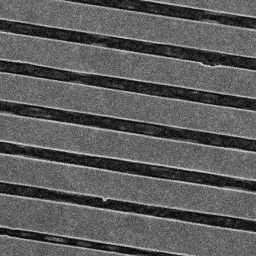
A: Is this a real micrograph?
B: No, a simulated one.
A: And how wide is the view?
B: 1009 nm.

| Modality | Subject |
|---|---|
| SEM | parallel lines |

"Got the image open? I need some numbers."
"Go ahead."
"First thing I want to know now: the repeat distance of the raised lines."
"0.16 µm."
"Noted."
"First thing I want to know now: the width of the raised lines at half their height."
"108 nm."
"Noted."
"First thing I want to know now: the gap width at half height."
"0.0501 micrometres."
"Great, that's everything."